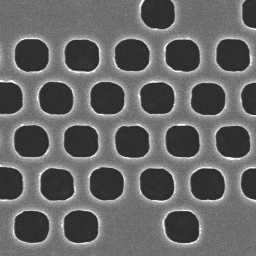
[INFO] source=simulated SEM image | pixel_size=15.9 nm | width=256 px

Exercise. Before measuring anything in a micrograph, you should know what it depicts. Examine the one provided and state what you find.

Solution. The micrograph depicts a regular array of holes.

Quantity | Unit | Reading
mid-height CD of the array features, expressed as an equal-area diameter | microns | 0.555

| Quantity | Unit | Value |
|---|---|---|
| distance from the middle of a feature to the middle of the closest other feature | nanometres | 788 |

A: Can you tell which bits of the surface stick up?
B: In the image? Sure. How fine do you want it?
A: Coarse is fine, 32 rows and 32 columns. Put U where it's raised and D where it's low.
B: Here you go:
UUUUUUUUUUUUUUUUUUDDDDUUUUUUUUDD
UUUUUUUUUUUUUUUUUUDDDDUUUUUUUUDD
UUUUUUUUUUUUUUUUUUDDDDUUUUUUUUDD
UUUUUUUUUUUUUUUUUUUDDUUUUUUUUUUU
UUUUUUUUUUUUUUUUUUUUUUUUUUUUUUUU
UUDDDDUUDDDDUUUDDDUUUDDDUUUDDDDU
UUDDDDUUDDDDUUDDDDDUUDDDDUUDDDDU
UUDDDDUUDDDDUUDDDDDUUDDDDUUDDDDU
UUDDDDUUUDDDUUUDDDUUUDDDDUUUDDDU
UUUUUUUUUUUUUUUUUUUUUUUUUUUUUUUU
DDUUUUDDUUUUDDDUUUDDDUUUUDDUUUUD
DDDUUDDDDUUDDDDUUUDDDDUUDDDDUUDD
DDDUUDDDDUUDDDDDUUDDDDUUDDDDUUDD
DDDUUDDDDUUUDDDUUUDDDDUUDDDDUUDD
UUUUUUUUUUUUUUUUUUUUUUUUUUUUUUUU
UUUUUUUUUUUUUUUUUUUUUUUUUUUUUUUU
UUDDDDUUDDDDUUUDDDUUUDDDDUUDDDDU
UUDDDDUUDDDDUUDDDDDUUDDDDUUDDDDU
UUDDDDUUDDDDUUUDDDDUUDDDDUUDDDDU
UUUDDUUUUDDUUUUDDDUUUUDDUUUUDDUU
UUUUUUUUUUUUUUUUUUUUUUUUUUUUUUUU
DDUUUDDDDUUUDDDUUUDDDUUUDDDUUUUD
DDDUUDDDDUUDDDDUUDDDDDUUDDDDUUDD
DDDUUDDDDUUDDDDUUUDDDDUUDDDDUUDD
DDUUUDDDDUUUDDDUUUDDDUUUDDDDUUUD
UUUUUUUUUUUUUUUUUUUUUUUUUUUUUUUU
UUUDDUUUUDDUUUUUUUUUUUDDUUUUUUUU
UUDDDDUUDDDDUUUUUUUUUDDDDUUUUUUU
UUDDDDUUDDDDUUUUUUUUUDDDDUUUUUUU
UUDDDDUUDDDDUUUUUUUUUDDDDUUUUUUU
UUUUUUUUUUUUUUUUUUUUUUUUUUUUUUUU
UUUUUUUUUUUUUUUUUUUUUUUUUUUUUUUU